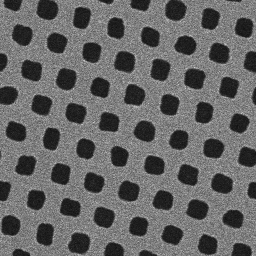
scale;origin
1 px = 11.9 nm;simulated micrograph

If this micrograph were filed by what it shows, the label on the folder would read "a regular array of holes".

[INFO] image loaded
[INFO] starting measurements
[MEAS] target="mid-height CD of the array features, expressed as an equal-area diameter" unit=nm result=245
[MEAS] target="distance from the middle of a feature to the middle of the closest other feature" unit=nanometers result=416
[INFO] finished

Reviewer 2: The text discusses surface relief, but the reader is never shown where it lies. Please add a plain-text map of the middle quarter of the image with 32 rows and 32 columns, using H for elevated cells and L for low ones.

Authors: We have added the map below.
HHHHHHHHHHHHLLLLLLHHHHLLLLLHHHHH
LLHHHHHHHHHHHLLLLHHHHHLLLLHHHHHL
LLLHHHHHHHHHHHHHHHHHHHLLLLHHHHLL
LLLHHHHHLHHHHHHHHHHHHHLLLLHHHHLL
LLLHHHHLLLLHHHHHHHHHHHHHHHHHHHLL
LLHHHHHLLLLHHHHHLLHHHHHHHHHHHHHL
LHHHHHHLLLLHHHHLLLLLHHHHHHHHHHHH
HHHHHHHLLLLHHHHLLLLLHHHHHLHHHHHH
HHHHHHHHHHHHHHHLLLLLHHHHLLLLHHHH
HHHHHHHHHHHHHHHLLLLLHHHHLLLLLHHH
HLLLLHHHHHHHHHHHHHHHHHHHLLLLLHHH
LLLLLLHHHHHHHHHHHHHHHHHHLLLLHHHH
LLLLLLHHHLLLHHHHHHHHHHHHHLLLHHHH
HLLLLHHHHLLLLLHHHHHHHHHHHHHHHHHH
HHLLLHHHHLLLLLHHHHHLLHHHHHHHHHHH
HHHHHHHHHLLLLLHHHHLLLLHHHHHHHHHH
HHHHHHHHHLLLLHHHHLLLLLLHHHHHLLHH
HHHHHHHHHHHHHHHHHLLLLLLHHHHLLLLH
HHHHHHHHHHHHHHHHHHLLLLLHHHHLLLLH
HHHHLLLHHHHHHHHHHHHHLHHHHHLLLLLH
HHHLLLLLHHHHHHHHHHHHHHHHHHLLLLLH
HHHLLLLLHHHHLLLLHHHHHHHHHHHHHHHH
HHHLLLLHHHHHLLLLHHHHHHHHHHHHHHHH
HHHHLLLHHHHHLLLLHHHHHLLLHHHHHHHH
HHHHHHHHHHHHLLLLHHHHLLLLLHHHHHHH
LHHHHHHHHHHHHLLHHHHHLLLLLHHHHLLL
LLHHHHHHHHHHHHHHHHHHLLLLLHHHHLLL
LHHHHHLLHHHHHHHHHHHHHLLLHHHHLLLL
LHHHHLLLLLHHHHHHHHHHHHHHHHHHLLLL
LHHHHLLLLLHHHHHLLHHHHHHHHHHHHLLL
HHHHHLLLLLHHHHLLLLLHHHHHHHHHHHHH
HHHHHHLLLHHHHHLLLLLHHHHHLHHHHHHH